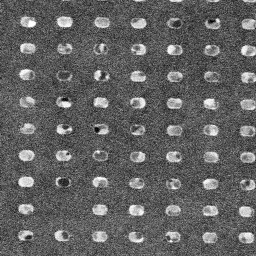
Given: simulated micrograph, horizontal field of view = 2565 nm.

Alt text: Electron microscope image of a regular array of raised bodies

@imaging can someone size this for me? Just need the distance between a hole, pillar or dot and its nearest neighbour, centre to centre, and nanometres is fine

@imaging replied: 266